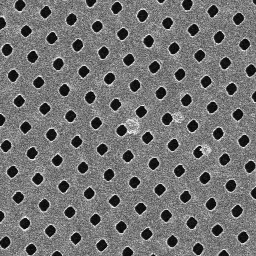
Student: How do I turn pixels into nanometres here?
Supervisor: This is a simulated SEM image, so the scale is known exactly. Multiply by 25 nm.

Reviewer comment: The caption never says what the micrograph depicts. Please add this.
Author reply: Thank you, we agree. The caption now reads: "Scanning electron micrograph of a regular array of holes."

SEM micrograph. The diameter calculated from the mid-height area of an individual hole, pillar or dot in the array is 276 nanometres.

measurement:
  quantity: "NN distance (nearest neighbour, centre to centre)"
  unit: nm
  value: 660